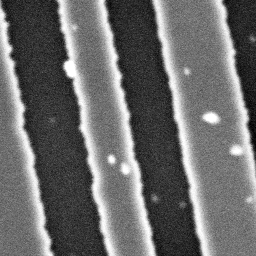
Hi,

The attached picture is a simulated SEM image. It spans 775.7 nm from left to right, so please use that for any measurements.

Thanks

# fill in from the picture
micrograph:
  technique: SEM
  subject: lines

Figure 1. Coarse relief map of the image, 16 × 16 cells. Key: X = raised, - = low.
----XXX---XXXX--
----XXX---XXXX--
----XXX---XXXX--
X---XXX---XXXXX-
X---XXX----XXXX-
X----XXX---XXXX-
X----XXX---XXXX-
X----XXX---XXXX-
XX---XXX---XXXX-
XX----XX---XXXXX
XX----XXX---XXXX
XX----XXX---XXXX
XX----XXX---XXXX
XXX---XXX---XXXX
XXX---XXX---XXXX
XXX----XXX---XXX